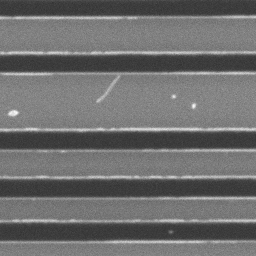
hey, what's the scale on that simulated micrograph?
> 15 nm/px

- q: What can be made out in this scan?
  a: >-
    lines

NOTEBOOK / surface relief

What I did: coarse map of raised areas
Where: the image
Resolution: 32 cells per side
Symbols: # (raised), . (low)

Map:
################################
################################
................................
................................
................................
................................
................................
################################
################################
................................
................................
................................
................................
................................
................................
................................
################################
################################
################################
................................
................................
................................
################################
################################
################################
................................
................................
................................
################################
################################
................................
................................